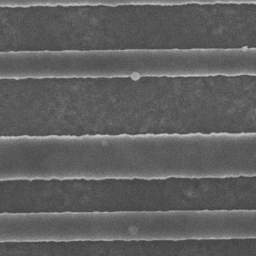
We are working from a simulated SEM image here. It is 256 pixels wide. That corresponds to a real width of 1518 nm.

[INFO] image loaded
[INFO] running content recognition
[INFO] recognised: lines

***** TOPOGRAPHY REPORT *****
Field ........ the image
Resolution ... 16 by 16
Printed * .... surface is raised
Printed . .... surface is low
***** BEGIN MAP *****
................
................
................
****************
****************
................
................
................
...*.***********
****************
****************
................
................
****************
****************
................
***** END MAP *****